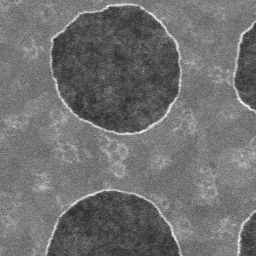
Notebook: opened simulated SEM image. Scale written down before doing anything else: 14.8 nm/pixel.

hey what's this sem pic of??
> holes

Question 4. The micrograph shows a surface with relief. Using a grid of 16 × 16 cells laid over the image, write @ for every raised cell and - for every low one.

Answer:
@@@@@@@--@@@@@@@
@@@@------@@@@@@
@@@--------@@@@-
@@@--------@@@@-
@@@--------@@@@-
@@@@-------@@@@-
@@@@-------@@@@-
@@@@@-----@@@@@@
@@@@@@@@@@@@@@@@
@@@@@@@@@@@@@@@@
@@@@@@@@@@@@@@@@
@@@@@@@@@@@@@@@@
@@@@@----@@@@@@@
@@@@------@@@@@@
@@@--------@@@@-
@@@--------@@@@-